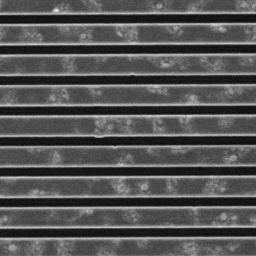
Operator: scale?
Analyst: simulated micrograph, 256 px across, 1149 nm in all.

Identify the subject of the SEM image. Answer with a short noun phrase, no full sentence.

parallel lines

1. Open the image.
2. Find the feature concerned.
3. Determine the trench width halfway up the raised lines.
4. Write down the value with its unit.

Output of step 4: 0.0404 um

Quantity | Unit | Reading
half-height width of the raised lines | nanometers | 94.3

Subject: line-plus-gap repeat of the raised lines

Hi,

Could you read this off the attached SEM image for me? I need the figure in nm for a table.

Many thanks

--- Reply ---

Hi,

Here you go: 137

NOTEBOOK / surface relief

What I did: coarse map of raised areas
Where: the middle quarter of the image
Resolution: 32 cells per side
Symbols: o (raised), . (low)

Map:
oooooooooooooooooooooooooooooooo
oooooooooooooooooooooooooooooooo
oooooooooooooooooooooooooooooooo
................................
................................
oooooooooooooooooooooooooooooooo
oooooooooooooooooooooooooooooooo
oooooooooooooooooooooooooooooooo
oooooooooooooooooooooooooooooooo
oooooooooooooooooooooooooooooooo
oooooooo....oo..................
................................
................................
oooooooooooooooooooooooooooooooo
oooooooooooooooooooooooooooooooo
oooooooooooooooooooooooooooooooo
oooooooooooooooooooooooooooooooo
oooooooooooooooooooooooooooooooo
................................
................................
.....ooooooooooooooooooooooooooo
oooooooooooooooooooooooooooooooo
oooooooooooooooooooooooooooooooo
oooooooooooooooooooooooooooooooo
oooooooooooooooooooooooooooooooo
oooooooooooooooooooooooooooooooo
................................
................................
oooooooooooooooooooooooooooooooo
oooooooooooooooooooooooooooooooo
oooooooooooooooooooooooooooooooo
oooooooooooooooooooooooooooooooo